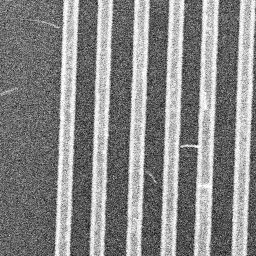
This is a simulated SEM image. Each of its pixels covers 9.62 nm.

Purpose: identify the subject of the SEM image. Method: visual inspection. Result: parallel lines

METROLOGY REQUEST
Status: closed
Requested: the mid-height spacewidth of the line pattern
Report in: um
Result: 0.233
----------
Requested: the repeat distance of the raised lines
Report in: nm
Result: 339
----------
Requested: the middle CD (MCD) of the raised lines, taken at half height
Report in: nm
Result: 99.7